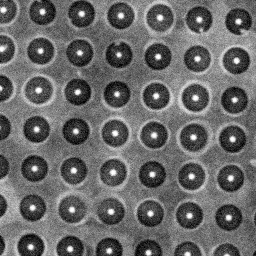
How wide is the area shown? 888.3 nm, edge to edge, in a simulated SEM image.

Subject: an array of small figures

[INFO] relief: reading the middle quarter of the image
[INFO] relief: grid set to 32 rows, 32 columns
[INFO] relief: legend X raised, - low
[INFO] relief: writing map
XXX--XXXXXXX----XXXXX-----XXXX--
XXXXXXXXXXXXXXXXXXXXXXX--XXXXXX-
XXXXXXXXXXXXXXXXXXXXXXXXXXXXXXXX
XXX-XXXXXXXXXXXXXXXXXXXXXXXXXXXX
X-----XXXXXX---XXXXXXXX-XXXXXXXX
-------XXXX-----XXXXX-----XXXX--
-------XXX-------XXX------XXXX--
-------XXX-------XX--------XX---
-------XXX-------XX--------XX---
X-----XXXX------XXXX-------XX---
XXXXXXXXXXX----XXXXX------XXXX--
XXXXXXXXXXXXXXXXXXXXXX--XXXXXXX-
XXXXXXXXXXXXXXXXXXXXXXXXXXXXXXXX
XX--XXXXXXXX-XXXXXXXXXXXXXXXXXXX
------XXXX-----XXXXXX---XXXXXXXX
------XXXX------XXXX-----XXXXX--
-------XX-------XXX-------XXX---
-------XX--------XX-------XXX---
------XXX-------XXX-------XXX---
X----XXXXX------XXX-------XXX---
XXXXXXXXXXX----XXXXX-----XXXX---
XXXXXXXXXXXXXXXXXXXXXX-XXXXXXX--
XXXXXXXXXXXXXXXXXXXXXXXXXXXXXXXX
X---XXXXXXXX--XXXXXXXXXXXXXXXXXX
-----XXXXX-----XXXXXX---XXXXXXX-
------XXX-------XXX------XXXXX--
------XXX-------XXX------XXXX---
------XXX-------XXX-------XX----
-----XXXX-------XXX------XXX----
-----XXXX------XXXX------XXXX---
XX-XXXXXXX----XXXXXX----XXXXX---
XXXXXXXXXXXXXXXXXXXXXXXXXXXXXX--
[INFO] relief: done